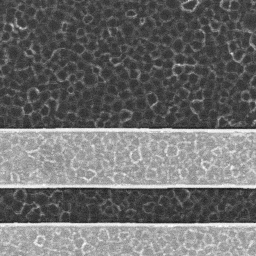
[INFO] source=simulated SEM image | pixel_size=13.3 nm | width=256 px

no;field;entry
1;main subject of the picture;one or a few lines or trenches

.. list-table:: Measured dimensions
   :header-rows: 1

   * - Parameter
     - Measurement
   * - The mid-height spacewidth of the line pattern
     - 499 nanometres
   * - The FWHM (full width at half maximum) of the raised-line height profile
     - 749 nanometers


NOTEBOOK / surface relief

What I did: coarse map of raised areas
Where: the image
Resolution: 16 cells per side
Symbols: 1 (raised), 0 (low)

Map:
0000000000000000
0000000000000000
0000000000000000
0000000000000000
0000000000000000
0000000000000000
0000000000000000
0000000000000000
1111111111111111
1111111111111111
1111111111111111
1111111111111111
0000000000000000
0000000000000000
1111111111111111
1111111111111111